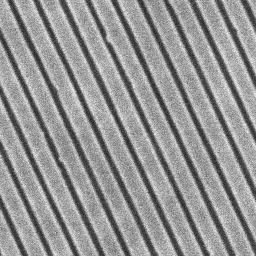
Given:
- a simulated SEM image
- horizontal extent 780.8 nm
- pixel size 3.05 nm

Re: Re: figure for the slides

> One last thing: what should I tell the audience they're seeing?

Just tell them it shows parallel lines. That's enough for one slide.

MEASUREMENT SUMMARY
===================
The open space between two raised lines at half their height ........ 19.5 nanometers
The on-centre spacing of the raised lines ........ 72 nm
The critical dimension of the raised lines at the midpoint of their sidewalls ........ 52.7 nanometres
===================